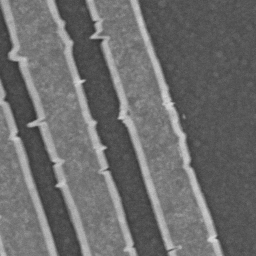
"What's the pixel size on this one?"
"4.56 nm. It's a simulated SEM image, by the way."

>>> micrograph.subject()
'one or a few lines or trenches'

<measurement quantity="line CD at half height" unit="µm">0.197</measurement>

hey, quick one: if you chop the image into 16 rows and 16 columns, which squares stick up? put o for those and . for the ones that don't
ooo...oo........
.ooo..ooo.......
.ooo..ooo.......
.ooo...ooo......
..ooo..ooo......
..ooo..ooo......
..ooo...ooo.....
o.oooo..ooo.....
o..ooo..ooo.....
o..ooo...ooo....
oo..ooo..ooo....
oo..ooo..ooo....
oo..ooo...ooo...
ooo..ooo..ooo...
ooo..ooo..ooo...
ooo..ooo...ooo..